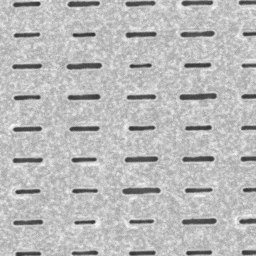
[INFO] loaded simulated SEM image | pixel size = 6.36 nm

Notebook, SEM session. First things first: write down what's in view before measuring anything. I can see a regular array of holes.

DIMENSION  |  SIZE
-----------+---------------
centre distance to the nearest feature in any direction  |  197 nm